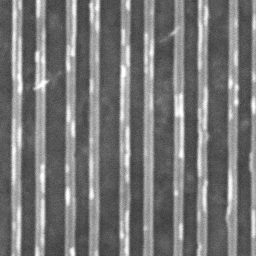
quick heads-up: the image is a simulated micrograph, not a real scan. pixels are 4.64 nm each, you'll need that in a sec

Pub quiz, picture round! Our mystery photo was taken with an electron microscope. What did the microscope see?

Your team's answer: parallel lines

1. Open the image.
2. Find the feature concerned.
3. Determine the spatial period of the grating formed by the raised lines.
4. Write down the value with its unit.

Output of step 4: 125 nanometres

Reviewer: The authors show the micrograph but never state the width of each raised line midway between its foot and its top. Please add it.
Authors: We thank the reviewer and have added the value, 37.1 nm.